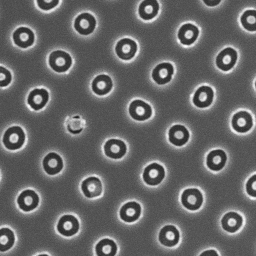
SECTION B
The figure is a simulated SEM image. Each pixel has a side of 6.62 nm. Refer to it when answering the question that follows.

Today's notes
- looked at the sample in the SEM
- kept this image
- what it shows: a regular array of ring-shaped grooves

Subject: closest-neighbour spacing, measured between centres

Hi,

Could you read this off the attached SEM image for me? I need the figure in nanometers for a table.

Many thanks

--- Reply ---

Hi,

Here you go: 293